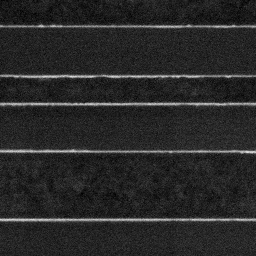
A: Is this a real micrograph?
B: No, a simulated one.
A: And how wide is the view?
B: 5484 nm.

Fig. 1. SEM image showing lines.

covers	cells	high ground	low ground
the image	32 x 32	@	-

--------------------------------
--------------------------------
--------------------------------
@@@@@@@@@@@@@@@@@@@@@@@@@@@@@@@@
@@@@@@@@@@@@@@@@@@@@@@@@@@@@@@@@
@@@@@@@@@@@@@@@@@@@@@@@@@@@@@@@@
@@@@@@@@@@@@@@@@@@@@@@@@@@@@@@@@
@@@@@@@@@@@@@@@@@@@@@@@@@@@@@@@@
@@@@@@@@@@@@@@@@@@@@@@@@@@@@@@@@
--@@@@@-@@@@-@@@@@@@@-@@@---@---
--------------------------------
--------------------------------
--------------------------------
@@@@@@@@@@@@@@@@@@@@@@@@@@@@@@@@
@@@@@@@@@@@@@@@@@@@@@@@@@@@@@@@@
@@@@@@@@@@@@@@@@@@@@@@@@@@@@@@@@
@@@@@@@@@@@@@@@@@@@@@@@@@@@@@@@@
@@@@@@@@@@@@@@@@@@@@@@@@@@@@@@@@
@@@@@@@@@@@@@@@@@@@@@@@@@@@@@@@@
--------------------------------
--------------------------------
--------------------------------
--------------------------------
--------------------------------
--------------------------------
--------------------------------
--------------------------------
@@@@@@@@@@@@@@@@@@@@@@@@@@@@@@@@
@@@@@@@@@@@@@@@@@@@@@@@@@@@@@@@@
@@@@@@@@@@@@@@@@@@@@@@@@@@@@@@@@
@@@@@@@@@@@@@@@@@@@@@@@@@@@@@@@@
@@@@@@@@@@@@@@@@@@@@@@@@@@@@@@@@